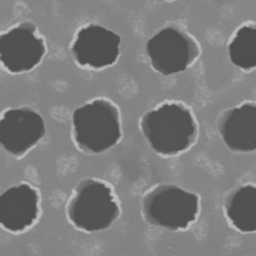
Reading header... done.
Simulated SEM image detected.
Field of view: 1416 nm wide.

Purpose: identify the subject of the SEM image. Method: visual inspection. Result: holes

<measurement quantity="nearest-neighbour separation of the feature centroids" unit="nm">400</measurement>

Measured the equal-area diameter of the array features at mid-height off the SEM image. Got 253 nm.